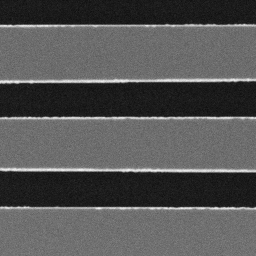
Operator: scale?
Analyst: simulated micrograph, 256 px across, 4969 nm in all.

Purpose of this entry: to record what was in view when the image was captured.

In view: lines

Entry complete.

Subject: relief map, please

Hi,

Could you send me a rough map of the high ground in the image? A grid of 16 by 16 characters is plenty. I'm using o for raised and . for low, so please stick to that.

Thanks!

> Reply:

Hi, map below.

................
................
oooooooooooooooo
oooooooooooooooo
oooooooooooooooo
................
................
oooooooooooooooo
oooooooooooooooo
oooooooooooooooo
oooooooooooooooo
................
................
oooooooooooooooo
oooooooooooooooo
oooooooooooooooo